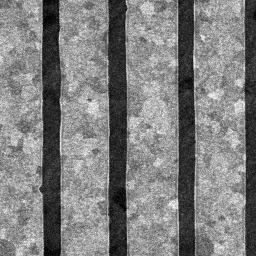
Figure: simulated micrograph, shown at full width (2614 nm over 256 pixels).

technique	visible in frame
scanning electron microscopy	one or a few lines or trenches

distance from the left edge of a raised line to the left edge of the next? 67.7 px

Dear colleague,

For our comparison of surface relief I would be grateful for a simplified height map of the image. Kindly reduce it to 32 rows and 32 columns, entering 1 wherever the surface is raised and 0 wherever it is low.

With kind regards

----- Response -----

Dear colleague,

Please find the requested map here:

11111001111110001111110011111100
11111001111110001111110011111100
11111001111110001111110011111100
11111001111111001111110011111100
11111001111110001111110011111110
11111001111110001111110011111110
11111000111110001111110011111110
11111000111110001111110011111100
11111000111110001111110011111100
11111000111110001111110011111100
11111000111110001111110011111100
11111000111110001111110011111100
11111000111111001111110011111100
11111000111111001111110011111100
11111000111111001111110011111100
11111000111111001111110011111100
11111000111111001111110011111110
11111000111111001111110001111110
11111000111111001111110011111110
11111000111111001111110011111110
11111000111111001111110001111110
11111000111111001111110001111110
11111000111110001111110011111110
11111000111110001111110011111110
11111000111110001111110011111110
11111000111110001111110011111110
11111000111110001111110011111110
11111000111110001111110011111110
11111000111110001111110011111110
11111000111110001111110001111110
11111000111110001111110001111110
11111000111110001111110011111110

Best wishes